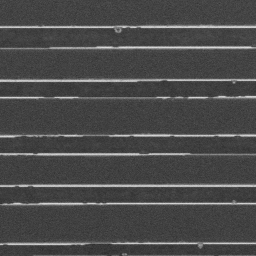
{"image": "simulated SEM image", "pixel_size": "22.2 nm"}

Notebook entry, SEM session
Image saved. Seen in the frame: lines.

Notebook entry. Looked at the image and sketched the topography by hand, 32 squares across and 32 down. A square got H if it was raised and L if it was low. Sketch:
HHHHHHHHHHHHHHHHHHHHHHHHHHHHHHHH
HHHHHHHHHHHHHHHHHHHHHHHHHHHHHHHH
HHHHHHHHHHHHHHHHHHHHHHHHHHHHHHHH
LLLLLLLLLLLLLLLLLLLLLLLLLLLLLLLL
LLLLLLLLLLLLLLLLLLLLLLLLLLLLLLLL
LLLLLLLLLLLLLLLLLLLLLLLLLLLLLLLL
HHHHHHHHHHHHHHHHHHHHHHHHHHHHHHHH
HHHHHHHHHHHHHHHHHHHHHHHHHHHHHHHH
HHHHHHHHHHHHHHHHHHHHHHHHHHHHHHHH
HHHHHHHHHHHHHHHHHHHHHHHHHHHHHHHH
LLLLLLLLLLLLLLLLLLLLLLLLLLLLLLLL
LLLLLLLLLLLLLLLLLLLLLLLLLLLLLLLL
HHHHHHHHHHHHHHHHHHHHHHHHHHHHHHHH
HHHHHHHHHHHHHHHHHHHHHHHHHHHHHHHH
HHHHHHHHHHHHHHHHHHHHHHHHHHHHHHHH
HHHHHHHHHHHHHHHHHHHHHHHHHHHHHHHH
HHHHHHHHHHHHHHHHHHHHHHHHHHHHHHHH
LLLLLLLLLLLLLLLLLLLLLLLLLLLLLLLL
LLLLLLLLLLLLLLLLLLLLLLLLLLLLLLLL
HHHHHHHHHHHHHHHHHHHHHHHHHHHHHHHH
HHHHHHHHHHHHHHHHHHHHHHHHHHHHHHHH
HHHHHHHHHHHHHHHHHHHHHHHHHHHHHHHH
HHHHHHHHHHHHHHHHHHHHHHHHHHHHHHHH
LLLLLLLLLLLLLLLLLLLLLLLLLLLLLLLL
LLLLLLLLLLLLLLLLLLLLLLLLLLLLLLLL
LLLLLLLLLLLLLLLLLLLLLLLLLLLLLLLL
HHHHHHHHHHHHHHHHHHHHHHHHHHHHHHHH
HHHHHHHHHHHHHHHHHHHHHHHHHHHHHHHH
HHHHHHHHHHHHHHHHHHHHHHHHHHHHHHHH
HHHHHHHHHHHHHHHHHHHHHHHHHHHHHHHH
LLLLLLLLLLLLLLLLLLLLLLLLLLLLLLLL
LLLLLLLLLLLLLLLLLLLLLLLLLLLLLLLL